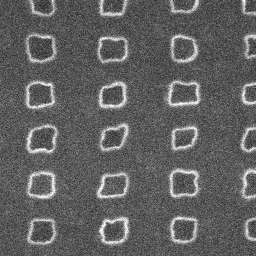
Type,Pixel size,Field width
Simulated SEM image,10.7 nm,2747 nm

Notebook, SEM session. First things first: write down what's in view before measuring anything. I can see a regular array of holes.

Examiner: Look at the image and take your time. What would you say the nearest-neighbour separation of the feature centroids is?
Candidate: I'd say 484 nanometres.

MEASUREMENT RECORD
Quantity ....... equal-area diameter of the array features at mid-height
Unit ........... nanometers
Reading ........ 255